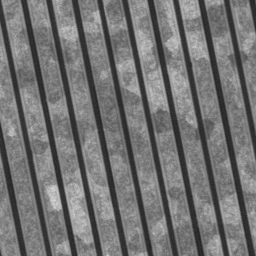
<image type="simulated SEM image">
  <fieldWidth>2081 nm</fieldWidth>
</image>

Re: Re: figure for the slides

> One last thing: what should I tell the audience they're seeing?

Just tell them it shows parallel lines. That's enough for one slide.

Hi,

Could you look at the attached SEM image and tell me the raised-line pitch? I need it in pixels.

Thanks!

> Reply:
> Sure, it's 24.8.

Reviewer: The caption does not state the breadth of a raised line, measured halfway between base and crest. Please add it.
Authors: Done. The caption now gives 142 nanometres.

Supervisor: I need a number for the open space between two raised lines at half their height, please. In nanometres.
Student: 56.8